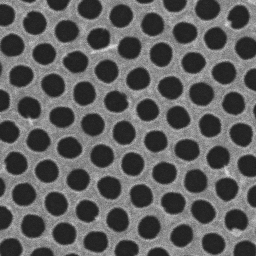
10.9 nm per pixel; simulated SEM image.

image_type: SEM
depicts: a regular array of holes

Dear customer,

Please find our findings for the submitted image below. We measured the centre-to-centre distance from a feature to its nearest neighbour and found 31.8 px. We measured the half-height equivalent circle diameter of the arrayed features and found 261 nanometers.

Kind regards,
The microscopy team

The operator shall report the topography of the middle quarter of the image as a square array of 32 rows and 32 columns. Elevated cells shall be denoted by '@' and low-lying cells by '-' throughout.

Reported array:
------@@-----@@@@@@@@@@---@@@---
@----@@@------@@@----@@@@@@@@@--
@@@@@@@@------@@-----@@@@@@@@@@@
@@@@@@@@-----@@-------@@@----@@@
@@@@--@@@@--@@@-------@@-----@@@
@@@----@@@@@@@@@-----@@-------@@
@@------@@@@@@@@@--@@@@-------@-
@@------@@@----@@@@@@@@@-----@@-
@@------@@------@@@@@@@@@---@@@-
@@@----@@@------@@@----@@@@@@@@@
@@@@@@@@@@------@@-----@@@@--@@@
--@@@@@@@@@----@@@------@@----@@
---@@@--@@@@@@@@@@------@@-----@
---@@-----@@@@@@@@@----@@-------
--@@------@@@@--@@@@@@@@@@------
-@@@------@@@----@@@@@@@@@@----@
@@@@@-----@@------@@@@-@@@@@@@@@
@@@@@@---@@@------@@@----@@@@@@@
---@@@@@@@@@------@@------@@@@@@
----@@@@@@@@@----@@@------@@----
-----@@@---@@@@@@@@@------@@----
-----@@-----@@@@@@@@@----@@@----
----@@-------@@----@@@@@@@@@----
---@@@-------@@-----@@@@@@@@@---
@@@@@@@-----@@------@@@@--@@@@@@
@@@@@@@@---@@@------@@@-----@@@@
@@---@@@@@@@@@@-----@@------@@@@
@-----@@@@@@@@@----@@@------@@@-
@------@@----@@@@@@@@@------@@--
@------@------@@@@@@@@@----@@@--
@-----@@------@@@----@@@@@@@@@--
@@---@@@------@@------@@@@@@@@@-